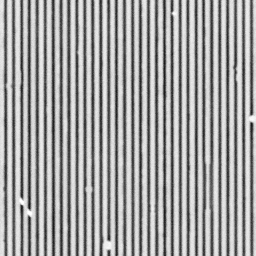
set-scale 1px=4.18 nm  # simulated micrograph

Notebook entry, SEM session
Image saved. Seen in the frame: parallel lines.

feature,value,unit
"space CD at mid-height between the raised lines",0.012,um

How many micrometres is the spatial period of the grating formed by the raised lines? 0.0331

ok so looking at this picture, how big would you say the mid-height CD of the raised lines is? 4.74 px